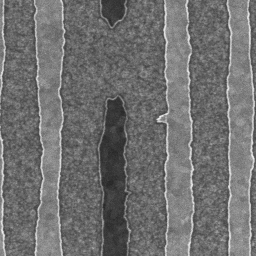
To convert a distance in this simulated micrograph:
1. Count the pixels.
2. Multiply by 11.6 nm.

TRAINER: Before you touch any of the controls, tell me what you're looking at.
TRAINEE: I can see one or a few lines or trenches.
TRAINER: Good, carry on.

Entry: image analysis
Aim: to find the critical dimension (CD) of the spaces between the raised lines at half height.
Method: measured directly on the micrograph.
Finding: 0.45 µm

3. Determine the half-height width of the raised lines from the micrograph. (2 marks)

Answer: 0.268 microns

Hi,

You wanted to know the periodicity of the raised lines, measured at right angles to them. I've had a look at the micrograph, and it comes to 734 nanometers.